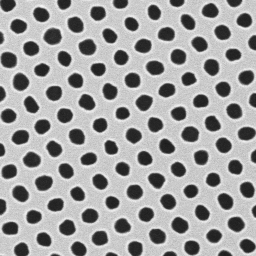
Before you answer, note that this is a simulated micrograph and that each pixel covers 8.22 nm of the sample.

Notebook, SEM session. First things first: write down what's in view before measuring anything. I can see a regular array of holes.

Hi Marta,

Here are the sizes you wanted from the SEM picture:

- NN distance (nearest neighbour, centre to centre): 202 nm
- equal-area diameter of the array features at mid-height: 0.124 um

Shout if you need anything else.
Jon